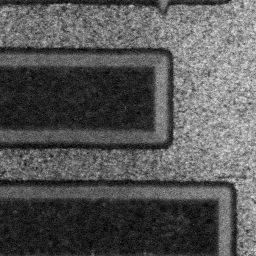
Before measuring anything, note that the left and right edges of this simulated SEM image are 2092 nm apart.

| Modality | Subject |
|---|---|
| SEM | one or a few lines or trenches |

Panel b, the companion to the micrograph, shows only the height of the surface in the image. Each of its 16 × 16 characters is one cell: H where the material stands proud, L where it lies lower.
LLLLLLLLLLLLLLLL
LLLLLLLLLLLLLLLL
LLLLLLLLLLLLLLLL
LLLLLLLLLLLLLLLL
HHHHHHHHHHLLLLLL
HHHHHHHHHHLLLLLL
HHHHHHHHHHLLLLLL
HHHHHHHHHHLLLLLL
HHHHHHHHHHLLLLLL
LLLLLLLLLLLLLLLL
LLLLLLLLLLLLLLLL
LLLLLLLLLLLLLLLL
HHHHHHHHHHHHHHLL
HHHHHHHHHHHHHHLL
HHHHHHHHHHHHHHLL
HHHHHHHHHHHHHHLL